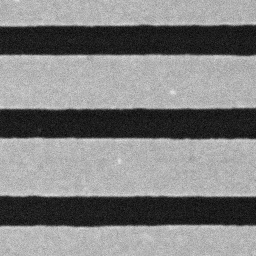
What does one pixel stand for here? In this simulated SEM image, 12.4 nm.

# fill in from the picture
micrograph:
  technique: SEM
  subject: lines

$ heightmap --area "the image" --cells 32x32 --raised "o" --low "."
oooooooooooooooooooooooooooooooo
oooooooooooooooooooooooooooooooo
oooooooooooooooooooooooooooooooo
................................
................................
................................
................................
oooooooooooooooooooooooooooooooo
oooooooooooooooooooooooooooooooo
oooooooooooooooooooooooooooooooo
oooooooooooooooooooooooooooooooo
oooooooooooooooooooooooooooooooo
oooooooooooooooooooooooooooooooo
ooooooooooooooooo.ooooooooo.....
................................
................................
................................
oooooooooooooooooooooooooooooooo
oooooooooooooooooooooooooooooooo
oooooooooooooooooooooooooooooooo
oooooooooooooooooooooooooooooooo
oooooooooooooooooooooooooooooooo
oooooooooooooooooooooooooooooooo
oooooooooooooooooooooooooooooooo
................................
................................
................................
................................
oooooooooooooooooooooooooooooooo
oooooooooooooooooooooooooooooooo
oooooooooooooooooooooooooooooooo
oooooooooooooooooooooooooooooooo